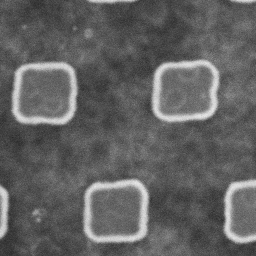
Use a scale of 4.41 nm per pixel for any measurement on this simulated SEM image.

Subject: raised bodies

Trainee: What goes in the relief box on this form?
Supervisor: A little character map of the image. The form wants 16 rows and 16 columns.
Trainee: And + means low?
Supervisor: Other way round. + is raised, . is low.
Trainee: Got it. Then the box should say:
................
................
................
................
.+++......+++...
.++++.....+++...
.++++.....+++...
.+++............
................
................
................
.......++......+
.....++++.....++
.....++++.....++
......+++.....++
................